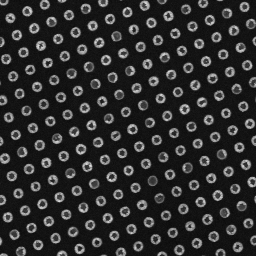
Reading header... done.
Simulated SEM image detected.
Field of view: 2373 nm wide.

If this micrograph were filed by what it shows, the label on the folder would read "a regular array of raised bodies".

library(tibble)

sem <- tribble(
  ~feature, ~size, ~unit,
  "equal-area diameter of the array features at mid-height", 0.093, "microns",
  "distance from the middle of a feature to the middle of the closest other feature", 170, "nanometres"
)